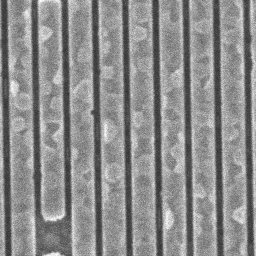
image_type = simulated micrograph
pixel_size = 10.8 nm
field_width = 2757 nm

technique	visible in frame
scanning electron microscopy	parallel lines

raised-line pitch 0.326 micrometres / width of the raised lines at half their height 246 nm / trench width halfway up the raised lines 84.8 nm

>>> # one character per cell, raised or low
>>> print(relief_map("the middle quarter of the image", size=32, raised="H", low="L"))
LLHHHHHLLHHHHHHLLHHHHHLLHHHHHHLL
LLHHHHHLLHHHHHHLLHHHHHLLHHHHHHLL
LLHHHHHLLHHHHHHLLHHHHHLLHHHHHHLL
LLHHHHHLLHHHHHHLLHHHHHLLHHHHHHLL
LLHHHHHLLHHHHHHLLHHHHHLLHHHHHHLL
LLHHHHHLLHHHHHHLLHHHHHLLHHHHHHLL
LLHHHHHLLHHHHHHLLHHHHHLLHHHHHHLL
LLHHHHHLLHHHHHHLLHHHHHLLHHHHHHLL
LLHHHHHLLHHHHHHLLHHHHHLLHHHHHHLL
LLHHHHHLLHHHHHHLLHHHHHLLHHHHHHLL
LLHHHHHLLHHHHHHLLHHHHHLLHHHHHHLL
LLHHHHHLLHHHHHHLLHHHHHLLHHHHHHLL
LLHHHHHLLHHHHHHLLHHHHHLLHHHHHHLL
LLHHHHHLLHHHHHHLLHHHHHLLLHHHHHLL
LLHHHHHLLHHHHHHLLHHHHHLLHHHHHHLL
LLHHHHHLLHHHHHHLLHHHHHLLLHHHHHLL
LLHHHHHLLHHHHHHLLHHHHHLLLHHHHHLL
LLHHHHHLLHHHHHHLLHHHHHLLLHHHHHLL
LLHHHHHLLHHHHHHLLHHHHHLLLHHHHHLL
LLHHHHHLLHHHHHHLLHHHHHLLLHHHHHLL
LLHHHHHLLHHHHHHLLHHHHHLLLHHHHHLL
LLHHHHHLLHHHHHHLLHHHHHLLLHHHHHLL
LLHHHHHLLHHHHHHLLHHHHHLLLHHHHHLL
LLHHHHHLLHHHHHHLLHHHHHLLLHHHHHLL
LLHHHHHLLHHHHHHLLHHHHHLLLHHHHHLL
LLHHHHHLLLHHHHHLLHHHHHLLLHHHHHLL
LLHHHHHLLLHHHHHLLHHHHHLLLHHHHHLL
LLHHHHHLLLHHHHHLLHHHHHLLLHHHHHLL
LLHHHHHLLLHHHHHLLHHHHHHLLHHHHHLL
LLHHHHHLLLHHHHHLLHHHHHHLLHHHHHLL
LLHHHHHLLLHHHHHLLHHHHHHLLHHHHHLL
LLHHHHHLLLHHHHHLLHHHHHHLLHHHHHLL